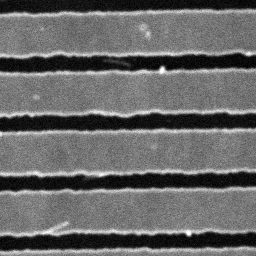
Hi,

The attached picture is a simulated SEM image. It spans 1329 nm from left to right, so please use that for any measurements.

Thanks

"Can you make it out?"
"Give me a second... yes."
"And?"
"lines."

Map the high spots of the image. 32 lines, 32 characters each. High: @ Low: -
--------------------------------
--------@--@@@@@@@@@@@@@@@@@@@@@
@@@@@@@@@@@@@@@@@@@@@@@@@@@@@@@@
@@@@@@@@@@@@@@@@@@@@@@@@@@@@@@@@
@@@@@@@@@@@@@@@@@@@@@@@@@@@@@@@@
@@@@@@@@@@@@@@@@@@@@@@@@@@@@@@@@
@@@@@@@@@@@@@@@@@@@@@@@@@@@@@@@@
--------------------------------
--------------------------------
@@@@@@@@@@@@@@@@@@@@@@@@@@@@@@@@
@@@@@@@@@@@@@@@@@@@@@@@@@@@@@@@@
@@@@@@@@@@@@@@@@@@@@@@@@@@@@@@@@
@@@@@@@@@@@@@@@@@@@@@@@@@@@@@@@@
@@@@@@@@@@@@@@@@@@@@@@@@@@@@@@@@
@@-------------@----------------
--------------------------------
-@@@@@@@@@@@@@@@@@@@@@@@@@@@@@@@
@@@@@@@@@@@@@@@@@@@@@@@@@@@@@@@@
@@@@@@@@@@@@@@@@@@@@@@@@@@@@@@@@
@@@@@@@@@@@@@@@@@@@@@@@@@@@@@@@@
@@@@@@@@@@@@@@@@@@@@@@@@@@@@@@@@
@@@@@@@@@@@@@@@@@@@@@@@@@@@@@--@
--------------------------------
-----------------------------@@@
@@@@@@@@@@@@@@@@@@@@@@@@@@@@@@@@
@@@@@@@@@@@@@@@@@@@@@@@@@@@@@@@@
@@@@@@@@@@@@@@@@@@@@@@@@@@@@@@@@
@@@@@@@@@@@@@@@@@@@@@@@@@@@@@@@@
@@@@@@@@@@@@@@@@@@@@@@@@@@@@@@@@
--@-----------------------------
--------------------------------
@@@@@@@@@@@@@@@@@@@@@@@@@@@@@@@@